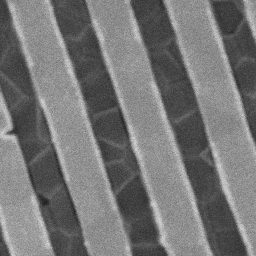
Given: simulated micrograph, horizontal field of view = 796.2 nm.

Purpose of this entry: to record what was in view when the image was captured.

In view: one or a few lines or trenches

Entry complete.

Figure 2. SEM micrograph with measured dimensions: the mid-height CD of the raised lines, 0.128 micrometres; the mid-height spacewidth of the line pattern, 105 nanometers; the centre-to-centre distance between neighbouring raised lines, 233 nm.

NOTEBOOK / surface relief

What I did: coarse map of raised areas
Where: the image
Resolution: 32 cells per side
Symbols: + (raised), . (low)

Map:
.+++++.....+++++.....+++++.....+
.++++++....++++++....+++++.....+
..+++++.....+++++....++++++....+
..+++++.....+++++.....+++++....+
..++++++....+++++.....+++++.....
...+++++.....+++++....++++++....
...+++++.....+++++.....+++++....
...++++++....++++++....++++++...
....+++++.....+++++....++++++...
....+++++.....+++++.....+++++...
....++++++....+++++.....++++++..
.....+++++.....+++++....++++++..
.....+++++.....+++++.....+++++..
+....++++++....++++++....+++++..
+.....+++++....++++++....++++++.
+.....+++++.....+++++.....+++++.
+.....++++++....+++++.....+++++.
++.....+++++....++++++....++++++
++.....+++++.....+++++....++++++
+++....++++++....+++++.....+++++
+++..+.++++++....++++++....+++++
+++.+++.+++++.....+++++....+++++
+++++++.++++++....+++++.....++++
++++....++++++....++++++....++++
++++.....+++++.....+++++....++++
+++++....++++++....+++++.....+++
+++++....++++++....++++++....+++
+++++.....+++++.....+++++....+++
++++++....+++++.....+++++.....++
.+++++....++++++....++++++....++
.+++++.....+++++....++++++.....+
.++++++....+++++.....+++++.....+